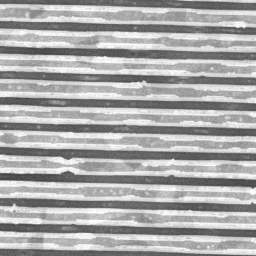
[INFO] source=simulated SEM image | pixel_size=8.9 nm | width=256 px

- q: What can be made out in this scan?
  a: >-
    parallel lines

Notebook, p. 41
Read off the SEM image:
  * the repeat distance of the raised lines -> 225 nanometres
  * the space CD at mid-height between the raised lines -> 93.4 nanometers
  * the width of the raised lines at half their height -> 0.127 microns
